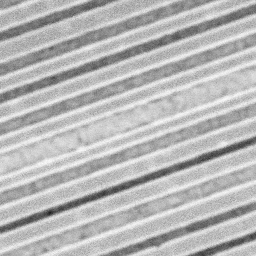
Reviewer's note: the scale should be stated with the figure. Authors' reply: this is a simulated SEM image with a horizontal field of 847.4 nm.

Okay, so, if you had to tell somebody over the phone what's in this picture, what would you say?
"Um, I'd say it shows parallel lines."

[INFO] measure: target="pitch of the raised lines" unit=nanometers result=101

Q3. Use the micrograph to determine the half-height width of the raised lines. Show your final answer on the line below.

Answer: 52.7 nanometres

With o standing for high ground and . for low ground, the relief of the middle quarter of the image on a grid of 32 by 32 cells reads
ooo.........ooooooooooo.........
.........oooooooooooo...........
......oooooooooooo...........ooo
...oooooooooooo...........oooooo
oooooooooooo...........ooooooooo
ooooooooo............ooooooooooo
oooooo............ooooooooooo...
oooo...........ooooooooooo......
o...........ooooooooooo.........
.........ooooooooooo............
......oooooooooooo..............
...oooooooooooo.................
.ooooooooooo.................ooo
ooooooooo.................oooooo
oooooo.................ooooooooo
ooo..................oooooooooo.
o.................oooooooooo....
...............oooooooooo.......
............oooooooooo..........
.........oooooooooo...........oo
......oooooooooo............oooo
....ooooooooo............ooooooo
.oooooooooo...........oooooooooo
oooooooo...........ooooooooooooo
ooooo...........ooooooooooooo...
oo...........ooooooooooooo......
...........oooooooooooo.......oo
........oooooooooooo.......ooooo
.....oooooooooooo.......oooooooo
..ooooooooooooo......ooooooooooo
oooooooooooo......oooooooooooooo
ooooooooo.......ooooooooooooo...